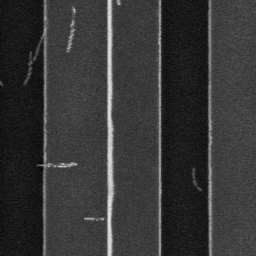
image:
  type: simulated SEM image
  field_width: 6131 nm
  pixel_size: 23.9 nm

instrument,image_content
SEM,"lines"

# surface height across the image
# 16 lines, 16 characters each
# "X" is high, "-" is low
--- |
---XXXXXXX---XXX
---XXXXXXX---XXX
---XXXXXXX---XXX
---XXXXXXX---XXX
---XXXXXXX---XXX
---XXXXXXX---XXX
---XXXXXXX---XXX
---XXXXXXX---XXX
---XXXXXXX---XXX
---XXXXXXX---XXX
---XXXXXXX---XXX
---XXXXXXX---XXX
---XXXXXXX---XXX
---XXXXXXX---XXX
---XXXXXXX---XXX
---XXXXXXX---XXX